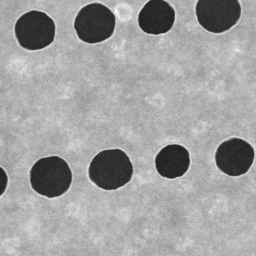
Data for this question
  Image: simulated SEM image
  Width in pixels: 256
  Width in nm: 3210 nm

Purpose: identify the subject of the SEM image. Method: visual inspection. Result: holes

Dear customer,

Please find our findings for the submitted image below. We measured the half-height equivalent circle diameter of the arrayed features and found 508 nanometres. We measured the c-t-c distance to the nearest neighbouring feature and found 759 nanometres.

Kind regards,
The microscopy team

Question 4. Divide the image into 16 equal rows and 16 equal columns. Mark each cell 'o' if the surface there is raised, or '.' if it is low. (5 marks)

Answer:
ooooo..oo..o...o
o..oo..oo..oo..o
o..oo.oooooooooo
oooooooooooooooo
oooooooooooooooo
oooooooooooooooo
oooooooooooooooo
oooooooooooooooo
oooooooooooooooo
oooooo..oo..oo..
oo..oo..oo..oo..
oo..oo..oooooooo
oooooooooooooooo
oooooooooooooooo
oooooooooooooooo
oooooooooooooooo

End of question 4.